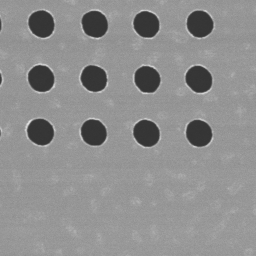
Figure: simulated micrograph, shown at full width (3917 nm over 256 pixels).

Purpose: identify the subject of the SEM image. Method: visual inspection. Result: a regular array of holes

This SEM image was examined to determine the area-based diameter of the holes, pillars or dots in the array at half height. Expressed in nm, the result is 407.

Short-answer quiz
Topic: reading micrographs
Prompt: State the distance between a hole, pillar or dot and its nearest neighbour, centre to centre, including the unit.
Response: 803 nanometers